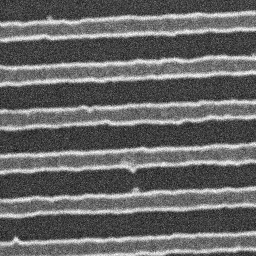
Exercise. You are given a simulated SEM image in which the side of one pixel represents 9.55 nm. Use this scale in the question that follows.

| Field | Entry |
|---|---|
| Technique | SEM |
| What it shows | parallel lines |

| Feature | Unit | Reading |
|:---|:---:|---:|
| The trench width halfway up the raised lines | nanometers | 264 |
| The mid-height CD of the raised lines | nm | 156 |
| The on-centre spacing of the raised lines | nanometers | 420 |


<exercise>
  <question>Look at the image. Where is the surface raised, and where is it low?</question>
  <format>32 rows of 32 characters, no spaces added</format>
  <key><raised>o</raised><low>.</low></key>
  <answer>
................................
................................
...........ooooooooooooooooooooo
oooooooooooooooooooooooooooooooo
oooooooooooo....................
................................
................................
........................oooooooo
oooooooooooooooooooooooooooooooo
ooooooooooooooooooooooo.........
ooo.............................
................................
................................
..........o.oooooooooooooooooooo
oooooooooooooooooooooooooooooooo
ooooooooooo.....................
................................
................................
.........................ooooooo
.ooooooooooooooooooooooooooooooo
ooooooooooooooooooooooo.........
o...............................
................................
................................
..........ooo..ooooooooooooooooo
oooooooooooooooooooooooooooooooo
ooooooooo.ooo.o.................
................................
................................
......................oooooooooo
oooooooooooooooooooooooooooooooo
ooooooooooooooooooooo...o.......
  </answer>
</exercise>